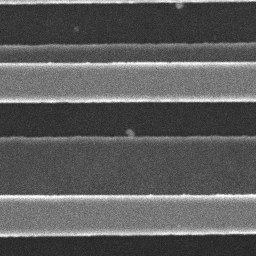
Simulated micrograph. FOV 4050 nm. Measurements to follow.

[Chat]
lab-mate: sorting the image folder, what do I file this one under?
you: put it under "lines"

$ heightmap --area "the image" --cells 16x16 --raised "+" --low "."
................
................
................
++++++++++++++++
++++++++++++++++
++++++++++++++++
................
................
................
++++++++++++++++
++++++++++++++++
++++++++++++++++
++++++++++++++++
++++++++++++++++
++++++++++++++++
................